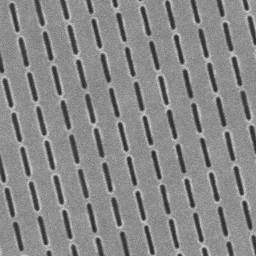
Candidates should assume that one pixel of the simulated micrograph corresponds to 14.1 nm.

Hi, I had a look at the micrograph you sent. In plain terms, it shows a regular array of holes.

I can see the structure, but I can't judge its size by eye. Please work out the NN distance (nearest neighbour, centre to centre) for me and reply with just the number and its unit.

357 nanometers